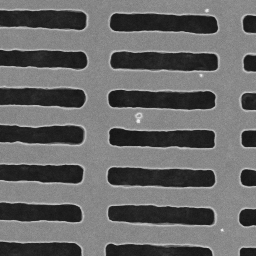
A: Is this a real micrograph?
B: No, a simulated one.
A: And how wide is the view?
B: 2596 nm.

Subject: holes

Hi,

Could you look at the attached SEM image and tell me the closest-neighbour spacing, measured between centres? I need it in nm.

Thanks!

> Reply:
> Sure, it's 387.